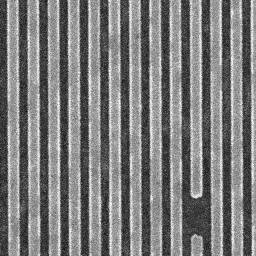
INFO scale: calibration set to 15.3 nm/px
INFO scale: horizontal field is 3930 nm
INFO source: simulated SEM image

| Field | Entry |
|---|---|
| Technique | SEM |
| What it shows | parallel lines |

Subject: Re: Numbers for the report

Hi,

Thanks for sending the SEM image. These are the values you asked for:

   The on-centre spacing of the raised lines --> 312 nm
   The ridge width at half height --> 159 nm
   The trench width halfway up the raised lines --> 9.75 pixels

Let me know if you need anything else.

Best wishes